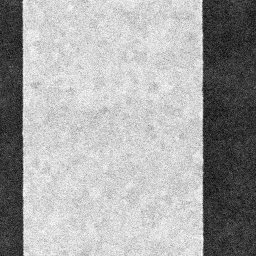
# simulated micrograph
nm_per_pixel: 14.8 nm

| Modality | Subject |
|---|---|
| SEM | one or a few lines or trenches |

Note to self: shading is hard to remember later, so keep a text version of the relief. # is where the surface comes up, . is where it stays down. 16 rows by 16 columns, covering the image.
.############...
.############...
.############...
.############...
.############...
.############...
.############...
.############...
.############...
.############...
.############...
.############...
.############...
.############...
..###########...
..###########...